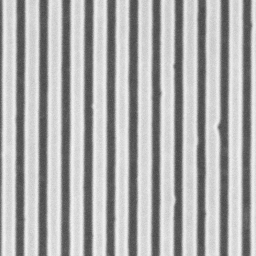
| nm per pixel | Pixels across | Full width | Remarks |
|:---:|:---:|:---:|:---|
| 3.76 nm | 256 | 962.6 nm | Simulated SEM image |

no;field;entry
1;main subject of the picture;parallel lines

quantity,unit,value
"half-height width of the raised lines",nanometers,45.6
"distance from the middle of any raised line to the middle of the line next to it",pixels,22.6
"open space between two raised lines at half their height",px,10.4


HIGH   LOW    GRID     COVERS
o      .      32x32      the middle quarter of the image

..ooo...oo...ooo...ooo..ooo...oo
..ooo...oo...ooo...ooo..ooo...oo
..ooo...oo...ooo...ooo..ooo...oo
..ooo...oo...ooo...ooo..ooo...oo
..ooo...oo...ooo...ooo..ooo...oo
..ooo...oo...ooo...ooo..ooo...oo
..ooo..ooo...ooo...ooo..ooo...oo
..ooo..ooo...ooo...ooo...oo...oo
..ooo...oo...ooo...ooo...oo...oo
..ooo...oo...ooo...ooo...oo...oo
..ooo..ooo...ooo...ooo..ooo...oo
..ooo..ooo...ooo...ooo..ooo...oo
..ooo..ooo...ooo...ooo..ooo...oo
..ooo..ooo...ooo...ooo...oo...oo
..ooo...oo...ooo...ooo..ooo...oo
..ooo...oo...ooo...ooo...oo...oo
..ooo...oo...ooo...ooo...oo...oo
..ooo..ooo...ooo...ooo..ooo...oo
..ooo..ooo...ooo...ooo..ooo...oo
..ooo...oo...ooo...ooo..ooo...oo
..ooo...oo...ooo...ooo..ooo...oo
..ooo...oo...ooo...ooo..ooo...oo
..ooo..ooo...ooo...ooo..ooo...oo
..ooo...oo...ooo...ooo..ooo...oo
..ooo..ooo...ooo...ooo..ooo...oo
..ooo...oo...ooo...ooo..ooo...oo
..ooo...oo...ooo...oo...ooo...oo
..ooo...oo...ooo...oo...ooo...oo
..ooo..ooo...ooo...oo...ooo...oo
..ooo..ooo...ooo...oo....oo...oo
..ooo..ooo...ooo...oo...ooo...oo
..ooo..ooo...ooo...oo...ooo...oo